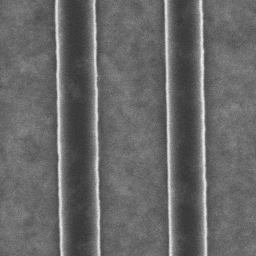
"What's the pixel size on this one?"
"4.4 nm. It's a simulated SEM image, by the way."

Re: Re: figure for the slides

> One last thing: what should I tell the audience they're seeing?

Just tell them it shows one or a few lines or trenches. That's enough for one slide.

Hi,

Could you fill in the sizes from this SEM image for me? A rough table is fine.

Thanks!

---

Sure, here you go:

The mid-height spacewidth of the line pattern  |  308 nanometers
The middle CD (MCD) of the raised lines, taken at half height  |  166 nanometres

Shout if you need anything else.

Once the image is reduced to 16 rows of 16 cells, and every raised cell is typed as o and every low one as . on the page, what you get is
....oo....ooo...
....oo....ooo...
....oo....ooo...
....oo....ooo...
....oo....ooo...
....oo....ooo...
....oo....ooo...
....oo....ooo...
....oo....ooo...
....oo.....oo...
....oo.....oo...
....oo.....oo...
....oo.....oo...
....oo.....oo...
....oo.....oo...
....oo.....oo...